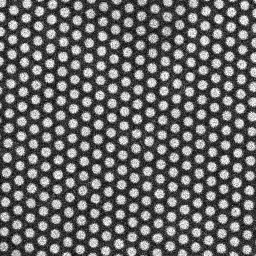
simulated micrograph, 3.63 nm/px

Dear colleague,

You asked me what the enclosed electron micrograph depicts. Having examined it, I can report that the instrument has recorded a regular array of raised bodies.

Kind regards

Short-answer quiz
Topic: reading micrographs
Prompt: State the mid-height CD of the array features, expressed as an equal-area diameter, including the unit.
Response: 33.3 nm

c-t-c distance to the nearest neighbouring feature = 52.8 nm